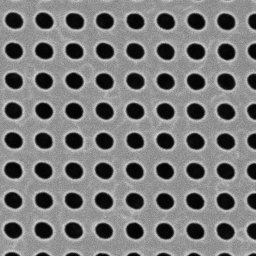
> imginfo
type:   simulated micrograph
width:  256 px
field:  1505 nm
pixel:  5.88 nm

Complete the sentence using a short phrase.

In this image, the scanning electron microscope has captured a regular array of holes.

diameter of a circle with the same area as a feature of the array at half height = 0.103 microns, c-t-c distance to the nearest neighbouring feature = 175 nanometres